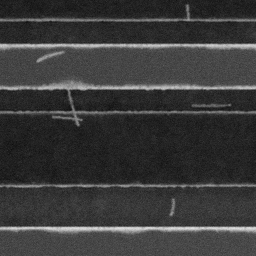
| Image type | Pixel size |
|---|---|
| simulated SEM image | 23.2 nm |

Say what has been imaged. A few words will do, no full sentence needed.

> lines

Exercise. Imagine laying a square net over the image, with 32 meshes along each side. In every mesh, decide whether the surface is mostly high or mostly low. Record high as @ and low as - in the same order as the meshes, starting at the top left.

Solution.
@@@@@@@@@@@@@@@@@@@@@@@@@@@@@@@@
@@@@@@@@@@@@@@@@@@@@@@@@@@@@@@@@
--------------@@------------@@--
--------------------------------
--------------------------------
--------------------------------
@@@@@@@@@@@@@@@@@@@@@@@@@@@@@@@@
@@@@@@@@@@@@@@@@@@@@@@@@@@@@@@@@
@@@@@@@@@@@@@@@@@@@@@@@@@@@@@@@@
@@@@@@@@@@@@@@@@@@@@@@@@@@@@@@@@
@@@@@@@@@@@@@@@@@@@@@@@@@@@@@@@@
--------------------------------
--------------------------------
--------------------------------
@@@@@@@@@@@@@@@@@@@@@@@@@@@@@@@@
@@@@@@@@@@@@@@@@@@@@@@@@@@@@@@@@
@@@@@@@@@@@@@@@@@@@@@@@@@@@@@@@@
@@@@@@@@@@@@@@@@@@@@@@@@@@@@@@@@
@@@@@@@@@@@@@@@@@@@@@@@@@@@@@@@@
@@@@@@@@@@@@@@@@@@@@@@@@@@@@@@@@
@@@@@@@@@@@@@@@@@@@@@@@@@@@@@@@@
@@@@@@@@@@@@@@@@@@@@@@@@@@@@@@@@
@@@@@@@@@@@@@@@@@@@@@@@@@@@@@@@@
--------------------------------
--------------------------------
--------------------------------
--------------------------------
--------------------------------
@@@@@@------------@@@---@@@@@---
@@@@@@@@@@@@@@@@@@@@@@@@@@@@@@@@
@@@@@@@@@@@@@@@@@@@@@@@@@@@@@@@@
@@@@@@@@@@@@@@@@@@@@@@@@@@@@@@@@